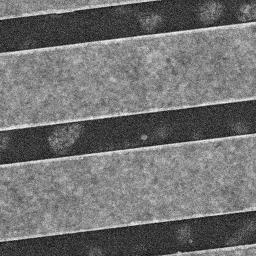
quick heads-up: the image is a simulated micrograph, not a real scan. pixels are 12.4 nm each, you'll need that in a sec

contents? one or a few lines or trenches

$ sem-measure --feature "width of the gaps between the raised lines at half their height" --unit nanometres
428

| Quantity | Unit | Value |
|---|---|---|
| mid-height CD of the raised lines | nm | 936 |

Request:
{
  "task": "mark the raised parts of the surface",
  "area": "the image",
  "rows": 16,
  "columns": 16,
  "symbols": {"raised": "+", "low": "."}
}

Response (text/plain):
++++++..........
...............+
.......+++++++++
++++++++++++++++
++++++++++++++++
++++++++++++++++
+++++++++++++...
+++++...........
...............+
.......+++++++++
++++++++++++++++
++++++++++++++++
++++++++++++++++
+++++++++++++...
+++++...........
..............++